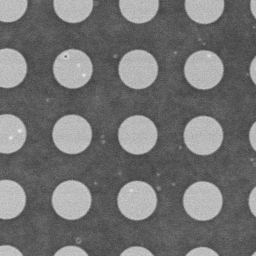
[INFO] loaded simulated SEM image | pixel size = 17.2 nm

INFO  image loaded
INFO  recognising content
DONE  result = an array of small figures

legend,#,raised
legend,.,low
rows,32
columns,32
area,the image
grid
###....#####...#####...#####...#
###....####....#####...#####...#
##......##......###.....###.....
................................
................................
................................
##......##......##.......#......
###....####....####....#####....
###....####....#####...#####...#
###....####....#####...#####...#
##......###.....###.....###.....
................................
................................
................................
##......##......................
###....####....####.....###.....
###....####....#####...#####...#
###....####....#####...#####...#
##.....####....####.....###.....
................................
................................
................................
................................
###....####....####.....###.....
###....####....####....#####...#
###....####....####....#####...#
###....####....####....####.....
................................
................................
................................
................................
##.....####....####.....###.....